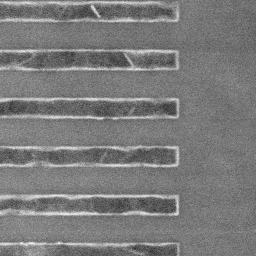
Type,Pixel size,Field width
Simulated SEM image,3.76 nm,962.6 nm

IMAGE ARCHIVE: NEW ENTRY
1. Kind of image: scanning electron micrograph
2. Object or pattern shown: wiring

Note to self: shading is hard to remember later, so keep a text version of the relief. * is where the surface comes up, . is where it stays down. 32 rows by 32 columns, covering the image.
********************............
**********************..........
*.....***...***.***.............
................................
................................
................................
*****************.***...........
**********************..........
..*******.************..........
................................
................................
................................
.**...******....................
**********************..........
**********************..........
................................
................................
................................
****.......****..*****..........
**********************..........
****..****..*****.****..........
................................
................................
................................
................................
**********************..........
*.********************..........
................................
................................
................................
.********.......***.**..........
**********************..........